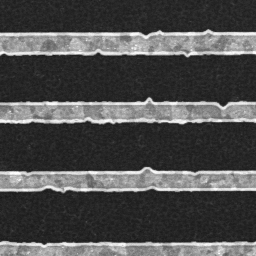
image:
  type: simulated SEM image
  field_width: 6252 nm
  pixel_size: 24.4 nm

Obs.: one or a few lines or trenches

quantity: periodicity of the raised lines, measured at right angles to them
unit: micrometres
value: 1.68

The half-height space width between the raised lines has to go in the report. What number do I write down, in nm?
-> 1280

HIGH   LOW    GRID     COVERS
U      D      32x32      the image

DDDDDDDDDDDDDDDDDDDDDDDDDDDDDDDD
DDDDDDDDDDDDDDDDDDDDDDDDDDDDDDDD
DDDDDDDDDDDDDDDDDDDDDDDDDDDDDDDD
DDDDDDDDDDDDDDDDDDDDDDDDDDDDDDDD
UUUUUUUUUUUUUUUUUUUUUUUUUUUUUUUU
UUUUUUUUUUUUUUUUUUUUUUUUUUUUUUUU
UUUUUUUUUUUUDUUUUUUUUUUUUUUUUUDD
DDDDDDDDDDDDDDDDDDDDDDDDDDDDDDDD
DDDDDDDDDDDDDDDDDDDDDDDDDDDDDDDD
DDDDDDDDDDDDDDDDDDDDDDDDDDDDDDDD
DDDDDDDDDDDDDDDDDDDDDDDDDDDDDDDD
DDDDDDDDDDDDDDDDDDDDDDDDDDDDDDDD
DDDDDDDDDDDDDDDDDDDDDDDDDDDDDDDD
UUUUUUUUUUUUUUUUUUUUUUUUUUUUUUUU
UUUUUUUUUUUUUUUUUUUUUUUUUUUUUUUU
DDDDDDDDDDDDDDDDDDDDDDDDDDDDDDDD
DDDDDDDDDDDDDDDDDDDDDDDDDDDDDDDD
DDDDDDDDDDDDDDDDDDDDDDDDDDDDDDDD
DDDDDDDDDDDDDDDDDDDDDDDDDDDDDDDD
DDDDDDDDDDDDDDDDDDDDDDDDDDDDDDDD
DDDDDDDDDDDDDDDDDDDDDDDDDDDDDDDD
DDDDDDDDDDDDDDDDDDUDDDDDDDDDDDDD
UUUUUUUUUUUUUUUUUUUUUUUUUUUUUUUU
UUUUUUUUUUUUUUUUUUDUUUUUUUUUUUUU
DDDDDDDDDDDDDDDDDDDDDDDDDDDDDDDD
DDDDDDDDDDDDDDDDDDDDDDDDDDDDDDDD
DDDDDDDDDDDDDDDDDDDDDDDDDDDDDDDD
DDDDDDDDDDDDDDDDDDDDDDDDDDDDDDDD
DDDDDDDDDDDDDDDDDDDDDDDDDDDDDDDD
DDDDDDDDDDDDDDDDDDDDDDDDDDDDDDDD
UUDDDDDDDDDDDDDDDDDDDDUDDDDUUUUU
UUUUUUUUUUUUUUUUUUUUUUUUUUUUUUUU